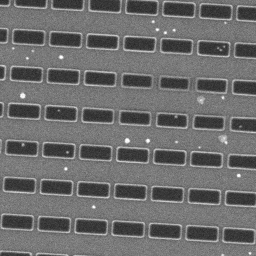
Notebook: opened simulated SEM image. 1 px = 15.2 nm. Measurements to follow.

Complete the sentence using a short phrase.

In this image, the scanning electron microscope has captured an array of small figures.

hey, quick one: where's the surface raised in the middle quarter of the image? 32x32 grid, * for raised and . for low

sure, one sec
................................
***.............................
****.********..**...............
****.********..*******..******..
****.********..*******..*******.
...........**..*******..*******.
..............................*.
................................
................................
................................
................................
***..*******....................
***..*******..********.*****....
***.********..********.********.
......******..********.********.
.......................********.
................................
................................
................................
................................
***.******......................
***.********.********..***......
***.********.********..*******..
.*..********.********.********..
.................****.********..
................................
................................
................................
................................
**..............................
**.********..*******............
**.********..********.********.*